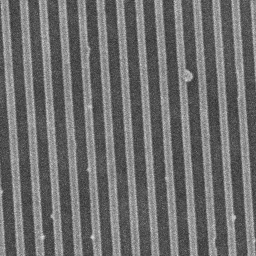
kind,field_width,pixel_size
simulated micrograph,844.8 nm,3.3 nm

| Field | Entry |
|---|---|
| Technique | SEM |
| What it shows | parallel lines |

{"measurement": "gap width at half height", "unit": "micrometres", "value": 0.0412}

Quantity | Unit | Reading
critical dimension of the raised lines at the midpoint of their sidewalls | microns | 0.0222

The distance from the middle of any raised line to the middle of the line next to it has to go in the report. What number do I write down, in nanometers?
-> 63.4